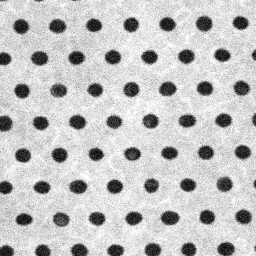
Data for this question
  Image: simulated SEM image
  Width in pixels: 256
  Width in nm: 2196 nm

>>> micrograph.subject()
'a regular array of holes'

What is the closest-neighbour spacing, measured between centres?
312 nanometers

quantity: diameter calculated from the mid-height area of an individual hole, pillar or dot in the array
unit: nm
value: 139